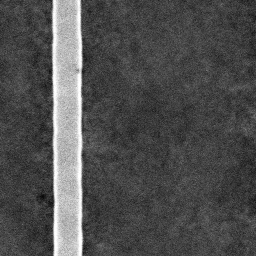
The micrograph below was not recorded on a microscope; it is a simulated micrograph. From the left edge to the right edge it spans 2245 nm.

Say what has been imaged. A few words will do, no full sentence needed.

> wiring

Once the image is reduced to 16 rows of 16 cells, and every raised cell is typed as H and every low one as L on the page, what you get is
LLLHHLLLLLLLLLLL
LLLHHLLLLLLLLLLL
LLLHHLLLLLLLLLLL
LLLHHLLLLLLLLLLL
LLLHHLLLLLLLLLLL
LLLHHLLLLLLLLLLL
LLLHHLLLLLLLLLLL
LLLHHLLLLLLLLLLL
LLLHHLLLLLLLLLLL
LLLHHLLLLLLLLLLL
LLLHHLLLLLLLLLLL
LLLHHLLLLLLLLLLL
LLLHHLLLLLLLLLLL
LLLHHLLLLLLLLLLL
LLLHHLLLLLLLLLLL
LLLHHLLLLLLLLLLL